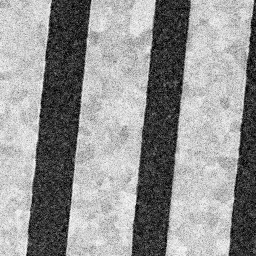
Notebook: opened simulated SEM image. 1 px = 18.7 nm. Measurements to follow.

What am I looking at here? one or a few lines or trenches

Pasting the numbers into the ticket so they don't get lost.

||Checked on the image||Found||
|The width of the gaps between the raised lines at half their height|676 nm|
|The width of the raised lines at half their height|1.17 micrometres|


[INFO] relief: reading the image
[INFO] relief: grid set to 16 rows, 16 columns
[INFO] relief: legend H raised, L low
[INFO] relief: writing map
HHHLLLHHHHLLHHHH
HHHLLLHHHHLLHHHH
HHHLLHHHHLLLHHHH
HHHLLHHHHLLLHHHL
HHHLLHHHHLLLHHHL
HHHLLHHHHLLHHHHL
HHHLLHHHHLLHHHHL
HHLLLHHHHLLHHHHL
HHLLHHHHHLLHHHHL
HHLLLHHHHLLHHHHL
HHLLLHHHHLLHHHHL
HHLLLHHHHLLHHHHL
HHLLHHHHLLLHHHHL
HHLLHHHHLLLHHHHL
HHLLHHHHLLHHHHLL
HHLLHHHHLLHHHHLL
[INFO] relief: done